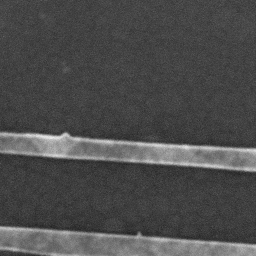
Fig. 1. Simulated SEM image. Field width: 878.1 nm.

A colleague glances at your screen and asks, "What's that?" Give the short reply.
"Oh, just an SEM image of one or a few lines or trenches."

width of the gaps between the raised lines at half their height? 255 nanometres